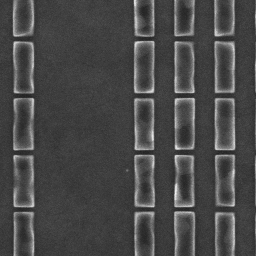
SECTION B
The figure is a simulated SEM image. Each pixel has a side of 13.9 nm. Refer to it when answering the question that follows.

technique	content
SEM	wiring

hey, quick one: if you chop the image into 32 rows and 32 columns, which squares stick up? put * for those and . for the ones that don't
..**.............**...**...**...
..**.............**...**...**...
..**.............**...**...**...
..**.............**...**...**...
................................
..**.............**...**...**...
..**.............**...**...**...
..**.............**...**...**...
..**.............**...**...**...
..**.............**...**...**...
..**.............**...**...**...
..**.............**...**...*....
..**.............*....**...**...
..**.............**...**...**...
..**.............**...**...**...
..**.............**...**...**...
..**.............**...**...**...
..**.............**...**...**...
..**.............**...**...**...
.................**...**...**...
..**.............**...**...**...
..**.............**...**...**...
..**.............**...**...**...
..**.............**...**...**...
..**.............**...**...**...
..**.............**...**...**...
................................
..**.............**...**...**...
..**.............**...**...**...
..**.............**...**...**...
..**.............**...**...**...
..**.............**...**...**...